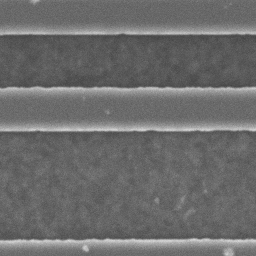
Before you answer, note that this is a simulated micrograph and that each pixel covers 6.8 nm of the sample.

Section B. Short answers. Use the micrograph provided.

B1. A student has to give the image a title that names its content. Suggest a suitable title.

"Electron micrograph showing lines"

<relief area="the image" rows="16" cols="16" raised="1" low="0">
1111111111111111
1111111111111111
0000000000000000
0000000000000000
0000000000000000
0111111111111111
1111111111111111
1111111111111111
0000000000000000
0000000000000000
0000000000000000
0000000000000000
0000000000000000
0000000000000000
0000000000000000
1111111111111111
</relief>